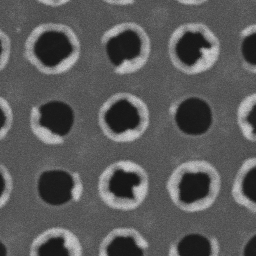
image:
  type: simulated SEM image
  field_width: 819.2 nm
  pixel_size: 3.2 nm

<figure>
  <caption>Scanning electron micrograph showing a regular array of holes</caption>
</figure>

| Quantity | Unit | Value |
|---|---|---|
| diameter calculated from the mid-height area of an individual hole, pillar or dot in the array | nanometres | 109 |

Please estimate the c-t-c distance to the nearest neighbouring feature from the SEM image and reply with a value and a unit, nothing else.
216 nanometers